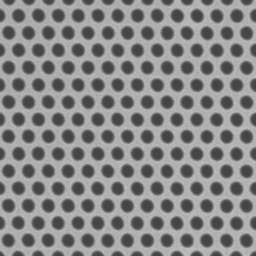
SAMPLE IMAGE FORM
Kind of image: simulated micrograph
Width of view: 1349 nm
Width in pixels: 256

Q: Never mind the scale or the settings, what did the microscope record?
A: a regular array of holes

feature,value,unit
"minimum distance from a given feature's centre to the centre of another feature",104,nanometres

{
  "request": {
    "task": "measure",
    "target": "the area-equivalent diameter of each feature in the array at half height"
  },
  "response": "67.5 nanometers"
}